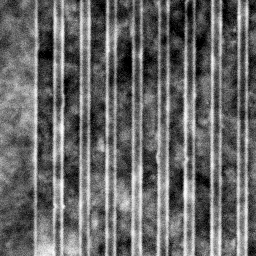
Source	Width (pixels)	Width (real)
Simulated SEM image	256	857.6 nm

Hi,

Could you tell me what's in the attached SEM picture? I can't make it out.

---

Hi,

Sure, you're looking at parallel lines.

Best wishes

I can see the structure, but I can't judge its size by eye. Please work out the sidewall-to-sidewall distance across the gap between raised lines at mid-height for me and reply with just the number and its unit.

56.1 nm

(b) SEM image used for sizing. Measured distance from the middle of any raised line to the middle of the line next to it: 88.1 nm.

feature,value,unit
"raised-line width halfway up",32.3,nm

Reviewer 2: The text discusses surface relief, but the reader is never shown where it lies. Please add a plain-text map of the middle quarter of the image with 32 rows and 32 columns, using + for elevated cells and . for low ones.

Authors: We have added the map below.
....++.....++....++.....++....++
....++.....++....++.....++....++
....++.....++....++.....++....++
....++.....++....++.....++....++
....++.....++....++.....++....++
....++.....++....++.....++....++
....++.....++....++.....++....++
....++.....++....++.....++....++
....++.....++....++.....++....++
....++.....++....++.....++....++
....++.....++....++.....++....++
....++.....++....++.....++....++
....++.....++....++.....++....++
....++.....++....++.....++....++
....++.....++....++.....++....++
....++.....++....++.....++....++
....++.....++....++.....++....++
....++.....++....++.....++....++
....++.....++....++.....++.....+
....++.....++....++.....++.....+
....++.....++....++.....++.....+
....++.....++....++.....++....++
....++.....++....++....+++....++
....++.....++....++....+++....++
....++.....++....++....+++....++
....++.....++....++.....++....++
....++.....++....++.....++....++
....++.....++....++.....++....++
....++.....++....++.....++....++
....++.....++....++.....++....++
....++.....++....++.....++....++
....++.....++....++.....++....++